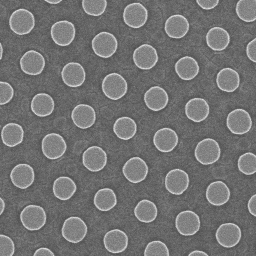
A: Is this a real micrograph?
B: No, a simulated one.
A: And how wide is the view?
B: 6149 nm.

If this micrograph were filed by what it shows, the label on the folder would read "a regular array of raised bodies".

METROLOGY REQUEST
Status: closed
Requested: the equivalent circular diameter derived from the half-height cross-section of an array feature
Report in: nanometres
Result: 579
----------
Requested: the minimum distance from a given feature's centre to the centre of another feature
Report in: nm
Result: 1020